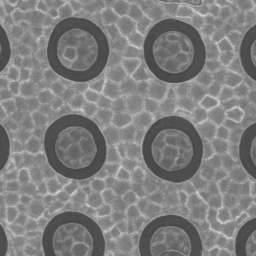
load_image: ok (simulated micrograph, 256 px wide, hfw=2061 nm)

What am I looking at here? ring-shaped grooves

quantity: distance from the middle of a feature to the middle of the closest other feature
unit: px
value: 97.1